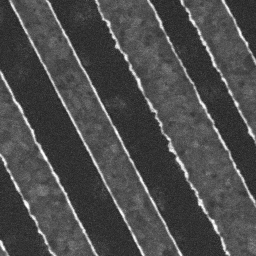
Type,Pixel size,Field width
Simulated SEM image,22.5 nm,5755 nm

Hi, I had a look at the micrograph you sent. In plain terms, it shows one or a few lines or trenches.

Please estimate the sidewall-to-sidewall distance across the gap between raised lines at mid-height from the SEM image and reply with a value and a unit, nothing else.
920 nm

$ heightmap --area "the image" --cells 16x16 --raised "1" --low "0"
0110001111001100
0111000111001110
0011000111100110
0011100011100111
0001100011110011
1001110001110011
1000110001111001
1100011000111001
1100011000111100
1110001100011100
1110001100011110
0111000110001110
0111000110001111
0011100011000111
0001100011100011
0001110001100011